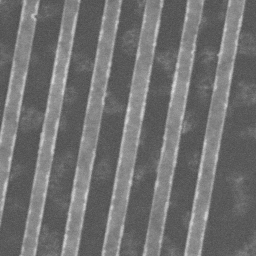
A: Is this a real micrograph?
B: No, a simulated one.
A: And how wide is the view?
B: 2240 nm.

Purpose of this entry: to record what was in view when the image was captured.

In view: parallel lines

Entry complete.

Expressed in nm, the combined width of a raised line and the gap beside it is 354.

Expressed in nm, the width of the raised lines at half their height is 132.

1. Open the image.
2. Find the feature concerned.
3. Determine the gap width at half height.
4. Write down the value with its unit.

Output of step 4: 0.223 microns